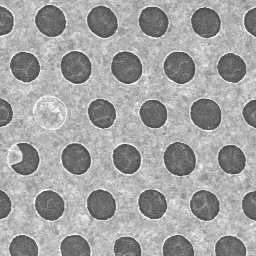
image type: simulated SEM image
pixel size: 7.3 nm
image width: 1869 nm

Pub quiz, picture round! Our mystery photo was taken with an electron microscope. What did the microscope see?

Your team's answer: a regular array of holes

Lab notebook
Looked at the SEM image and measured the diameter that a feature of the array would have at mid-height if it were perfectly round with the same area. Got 224 nanometers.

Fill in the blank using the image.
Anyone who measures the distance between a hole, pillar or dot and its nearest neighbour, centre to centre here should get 374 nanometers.